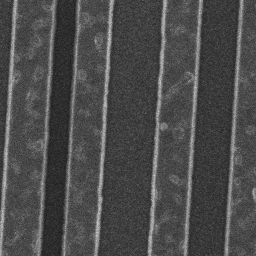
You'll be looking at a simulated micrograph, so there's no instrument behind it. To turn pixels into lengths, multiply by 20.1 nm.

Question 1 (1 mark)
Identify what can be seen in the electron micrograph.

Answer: one or a few lines or trenches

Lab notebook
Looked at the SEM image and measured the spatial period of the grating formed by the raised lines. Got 1500 nanometres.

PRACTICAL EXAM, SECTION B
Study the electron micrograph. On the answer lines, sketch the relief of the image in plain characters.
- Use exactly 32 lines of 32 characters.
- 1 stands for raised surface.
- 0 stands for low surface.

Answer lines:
00111110001111000000011110000011
00111110001111000000111110000011
00111110001111000000111110000011
00111110001111000000111110000011
00111110001111000000111110000011
00111110011111000000111110000011
00111100011111000000111110000011
01111100011111000000111110000011
01111100011111000000111110000011
01111100011110000000111110000011
01111100011110000000111110000111
01111100011110000000111100000111
01111100011110000000111100000111
01111100011110000000111100000111
01111100011110000000111100000111
01111100011110000000111100000111
01111100011110000000111100000111
01111100011110000000111100000111
01111100011110000001111100000111
01111100011110000001111100000111
01111100011110000001111100000111
01111100111110000001111100000111
01111000111110000001111100000111
11111000111110000001111100000111
11111000111110000001111100000111
11111000111110000001111100000111
11111000111100000001111100000111
11111000111100000001111000001111
11111000111100000001111000001111
11111000111100000001111000001111
11111000111100000001111000001111
11111000111100000001111000001111